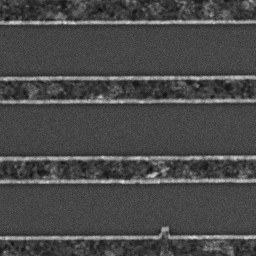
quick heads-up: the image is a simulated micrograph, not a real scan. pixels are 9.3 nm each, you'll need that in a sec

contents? one or a few lines or trenches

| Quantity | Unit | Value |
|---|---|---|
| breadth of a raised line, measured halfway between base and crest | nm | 217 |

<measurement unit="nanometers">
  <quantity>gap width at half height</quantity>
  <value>523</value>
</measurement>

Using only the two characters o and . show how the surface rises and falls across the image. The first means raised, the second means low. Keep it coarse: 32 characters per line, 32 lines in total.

oooooooooooooooooooooooooooooooo
oooooooooooooooooooooooooooooooo
oooooooooooooooooooooooooooooooo
................................
................................
................................
................................
................................
................................
................................
oooooooooooooooooooooooooooooooo
oooooooooooooooooooooooooooooooo
oooooooooooooooooooooooooooooooo
................................
................................
................................
................................
................................
................................
................................
oooooooooooooooooooooooooooooooo
oooooooooooooooooooooooooooooooo
oooooooooooooooooooooooooooooooo
................................
................................
................................
................................
................................
................................
....................o...........
oooooooooooooooooooooooooooooooo
oooooooooooooooooooooooooooooooo